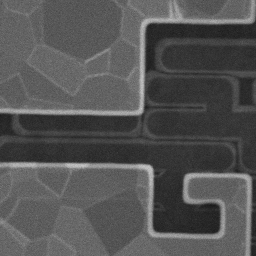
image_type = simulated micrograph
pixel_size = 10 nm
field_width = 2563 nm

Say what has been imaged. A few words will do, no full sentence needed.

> wiring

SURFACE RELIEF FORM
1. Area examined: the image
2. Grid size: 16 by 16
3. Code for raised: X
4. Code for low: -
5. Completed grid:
XXXXXXXXXXXXXXXX
XXXXXXXXX-------
XXXXXXXXX-------
XXXXXXXXX-------
XXXXXXXXX-------
XXXXXXXXX-------
XXXXXXXXX-------
----------------
----------------
----------------
XXXXXXXXX-------
XXXXXXXXX---XXXX
XXXXXXXXX---XXXX
XXXXXXXXX-----XX
XXXXXXXXXX----XX
XXXXXXXXXXXXXXXX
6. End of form